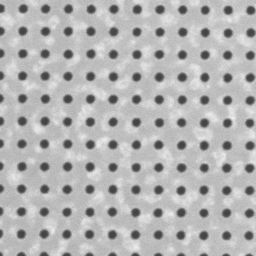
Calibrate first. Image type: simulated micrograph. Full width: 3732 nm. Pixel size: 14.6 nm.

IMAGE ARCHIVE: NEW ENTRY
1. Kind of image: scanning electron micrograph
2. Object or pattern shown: a regular array of holes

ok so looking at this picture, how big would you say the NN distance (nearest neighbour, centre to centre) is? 0.326 um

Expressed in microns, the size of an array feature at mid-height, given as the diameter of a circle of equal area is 0.141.